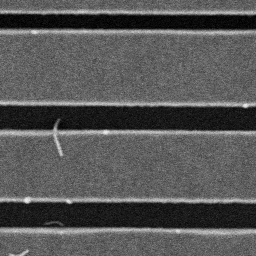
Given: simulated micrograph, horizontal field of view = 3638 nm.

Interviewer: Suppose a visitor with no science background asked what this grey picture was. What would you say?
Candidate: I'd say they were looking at lines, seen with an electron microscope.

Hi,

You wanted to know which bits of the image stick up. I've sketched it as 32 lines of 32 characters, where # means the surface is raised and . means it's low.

################################
################################
................................
................................
################################
################################
################################
################################
################################
################################
################################
################################
################################
................................
................................
................................
################################
################################
################################
################################
################################
################################
################################
################################
################################
................................
................................
................................
................................
################################
################################
################################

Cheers